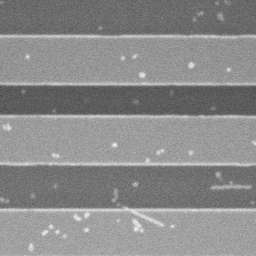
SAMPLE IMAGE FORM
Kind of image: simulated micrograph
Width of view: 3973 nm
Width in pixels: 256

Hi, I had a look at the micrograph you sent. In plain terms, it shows lines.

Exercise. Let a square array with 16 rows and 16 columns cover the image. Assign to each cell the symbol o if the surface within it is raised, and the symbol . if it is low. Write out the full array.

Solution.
................
................
oooooooooooooooo
oooooooooooooooo
oooooooooooooooo
................
................
oooooooooooooooo
oooooooooooooooo
oooooooooooooooo
................
................
................
oooooooooooooooo
oooooooooooooooo
oooooooooooooooo